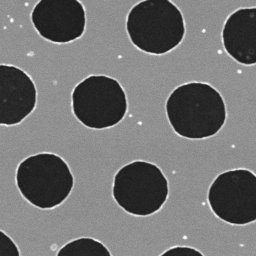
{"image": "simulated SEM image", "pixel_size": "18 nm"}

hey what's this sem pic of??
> holes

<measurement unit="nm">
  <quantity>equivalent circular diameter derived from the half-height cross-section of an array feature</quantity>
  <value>977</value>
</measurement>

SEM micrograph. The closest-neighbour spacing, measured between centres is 1720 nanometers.